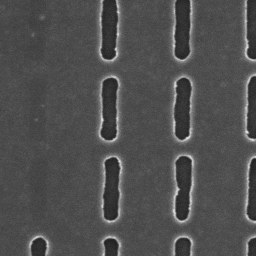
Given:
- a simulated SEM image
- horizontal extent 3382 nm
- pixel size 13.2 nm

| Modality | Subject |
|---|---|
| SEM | holes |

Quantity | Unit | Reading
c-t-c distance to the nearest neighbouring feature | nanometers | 960